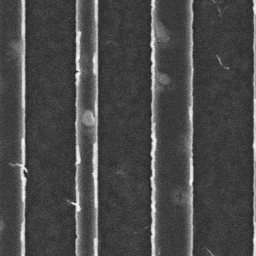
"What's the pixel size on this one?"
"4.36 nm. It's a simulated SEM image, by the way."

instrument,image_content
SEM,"one or a few lines or trenches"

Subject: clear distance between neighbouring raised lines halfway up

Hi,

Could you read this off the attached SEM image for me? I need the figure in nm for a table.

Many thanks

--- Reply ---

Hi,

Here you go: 238